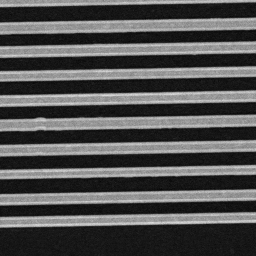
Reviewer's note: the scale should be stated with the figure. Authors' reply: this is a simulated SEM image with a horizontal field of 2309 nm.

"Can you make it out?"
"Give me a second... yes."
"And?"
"parallel lines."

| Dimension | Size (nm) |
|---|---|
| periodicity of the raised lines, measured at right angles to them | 218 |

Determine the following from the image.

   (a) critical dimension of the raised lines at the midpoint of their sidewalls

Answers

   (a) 0.08 microns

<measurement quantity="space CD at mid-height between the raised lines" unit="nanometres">144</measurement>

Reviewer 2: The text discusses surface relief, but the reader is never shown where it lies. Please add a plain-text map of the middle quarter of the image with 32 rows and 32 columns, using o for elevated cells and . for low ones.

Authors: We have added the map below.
................................
..................oooooooooooooo
oooooooooooooooooooooooooooooooo
ooooooooooooooooo...............
................................
................................
................................
..................oooooooooooooo
oooooooooooooooooooooooooooooooo
ooooooooooooooooooooooooooooo...
................................
................................
................................
..................oooooooo.ooooo
oooooooooooooooooooooooooooooooo
ooooooooooooooooooooooooooooo...
................................
................................
................................
................................
oooooooooooooooooooooooooooooooo
oooooooooooooooooooooooooooooooo
................................
................................
................................
................................
.ooooooooooooooooooooooooooooooo
oooooooooooooooooooooooooooooooo
................................
................................
................................
................................